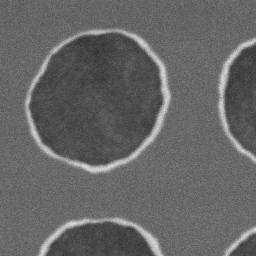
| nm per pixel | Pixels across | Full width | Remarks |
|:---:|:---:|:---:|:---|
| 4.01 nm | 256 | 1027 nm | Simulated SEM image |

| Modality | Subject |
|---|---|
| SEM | holes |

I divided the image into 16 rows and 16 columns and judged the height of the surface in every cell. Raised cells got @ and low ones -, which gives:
@@@@@@@@@@@@@@@@
@@@@@@@@@@@@@@@@
@@@@@----@@@@@@@
@@@-------@@@@@-
@@@-------@@@@--
@@--------@@@@--
@@--------@@@@--
@@--------@@@@--
@@-------@@@@@@-
@@@------@@@@@@-
@@@@@@@@@@@@@@@@
@@@@@@@@@@@@@@@@
@@@@@@@@@@@@@@@@
@@@@@@@@@@@@@@@@
@@@@-----@@@@@@@
@@@-------@@@@@-